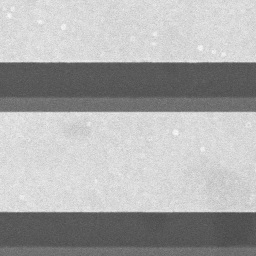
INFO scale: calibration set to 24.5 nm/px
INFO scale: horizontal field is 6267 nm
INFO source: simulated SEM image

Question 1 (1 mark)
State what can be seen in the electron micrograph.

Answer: lines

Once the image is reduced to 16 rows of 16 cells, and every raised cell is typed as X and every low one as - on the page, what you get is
XXXXXXXXXXXXXXXX
XXXXXXXXXXXXXXXX
XXXXXXXXXXXXXXXX
XXXXXXXXXXXXXXXX
----------------
----------------
----------------
XXXXXXXXXXXXXXXX
XXXXXXXXXXXXXXXX
XXXXXXXXXXXXXXXX
XXXXXXXXXXXXXXXX
XXXXXXXXXXXXXXXX
XXXXXXXXXXXXXXXX
----------------
----------------
----------------